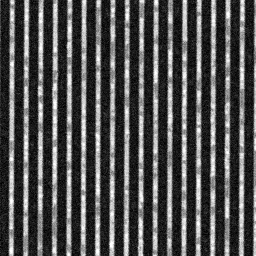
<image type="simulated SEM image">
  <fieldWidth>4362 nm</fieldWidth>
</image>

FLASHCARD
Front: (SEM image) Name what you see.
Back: parallel lines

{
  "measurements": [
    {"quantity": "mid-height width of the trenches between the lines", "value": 179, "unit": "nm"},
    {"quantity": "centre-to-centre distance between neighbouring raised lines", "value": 0.245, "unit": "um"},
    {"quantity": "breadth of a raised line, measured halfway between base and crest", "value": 66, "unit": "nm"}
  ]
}